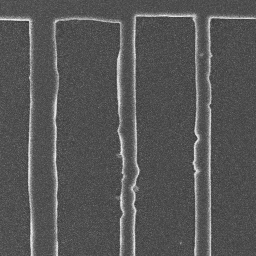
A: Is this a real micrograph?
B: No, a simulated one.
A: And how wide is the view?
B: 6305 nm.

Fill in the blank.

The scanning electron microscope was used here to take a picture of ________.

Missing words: one or a few lines or trenches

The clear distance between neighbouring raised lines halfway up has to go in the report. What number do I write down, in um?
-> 1.49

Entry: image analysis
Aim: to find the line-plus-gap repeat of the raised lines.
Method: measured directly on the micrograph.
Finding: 1960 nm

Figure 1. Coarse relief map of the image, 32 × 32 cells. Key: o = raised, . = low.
oooooooooooooooooooooooooooooooo
oooooooooooooooooooooooooooooooo
...oooooo..oooooo.......oo......
....ooo........oo.......oo......
....ooo........oo.......oo......
....ooo........oo.......oo......
....ooo........oo.......oo......
....ooo........oo.......oo......
....ooo........oo.......oo......
....ooo........oo.......oo......
....ooo........oo........o......
....ooo........oo........o......
....ooo........oo........o......
....ooo........oo........o......
....ooo........oo........o......
....ooo........oo.......oo......
....ooo........oo.......oo......
....ooo........oo........o......
....ooo........oo.......oo......
....ooo........oo.......oo......
....ooo........oo.......oo......
....ooo........oo.......oo......
....ooo........oo.......oo......
....ooo........oo.......oo......
....ooo........oo.......oo......
....ooo........oo.......oo......
....ooo........oo.......oo......
....ooo........oo.......oo......
....ooo........oo.......oo......
....ooo........oo.......oo......
....ooo........oo.......oo......
....ooo........oo.......oo......